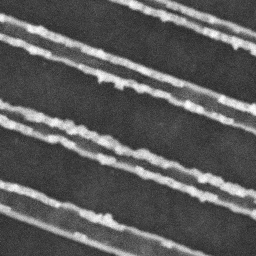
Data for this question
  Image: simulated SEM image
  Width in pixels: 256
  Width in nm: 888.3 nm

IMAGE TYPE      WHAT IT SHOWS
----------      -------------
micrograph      one or a few lines or trenches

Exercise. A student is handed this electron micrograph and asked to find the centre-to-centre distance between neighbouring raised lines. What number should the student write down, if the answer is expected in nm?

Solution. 270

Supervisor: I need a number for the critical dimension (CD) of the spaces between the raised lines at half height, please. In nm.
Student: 191